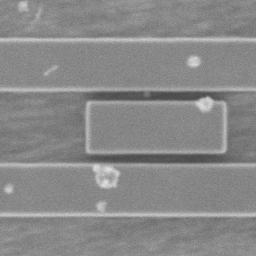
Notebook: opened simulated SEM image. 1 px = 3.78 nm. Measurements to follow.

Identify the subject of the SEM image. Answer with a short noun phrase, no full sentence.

groups of lines, slits or small figures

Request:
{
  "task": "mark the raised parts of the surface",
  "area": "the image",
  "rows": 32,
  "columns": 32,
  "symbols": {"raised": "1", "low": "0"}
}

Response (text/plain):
00000000000000000000000000000000
00000000000000000000000000000000
00000000000000000000000000000000
00000000000000000000000000000000
00000000000000000000000000000000
11111111111111111111111111111111
11111111111111111111111111111111
11111111111111111111111111111111
11111111111111111111111111111111
11111111111111111111111111111111
11111111111111111111111111111111
00000000000000000000000000000000
00000000000000000000000001000000
00000000000111111111111111110000
00000000000111111111111111110000
00000000000111111111111111110000
00000000000111111111111111110000
00000000000111111111111111110000
00000000000111111111111111110000
00000000000000000000000000000000
00000000000000000000000000000000
11111111111111111111111111111111
11111111111111111111111111111111
11111111111111111111111111111111
11111111111111111111111111111111
11111111111111111111111111111111
11111111111111111111111111111111
00000000000000000000000000000000
00000000000000000000000000000000
00000000000000000000000000000000
00000000000000000000000000000000
00000000000000000000000000000000